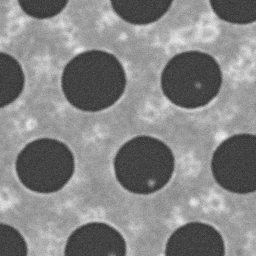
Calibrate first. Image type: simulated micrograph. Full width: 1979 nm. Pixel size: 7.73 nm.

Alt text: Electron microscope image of holes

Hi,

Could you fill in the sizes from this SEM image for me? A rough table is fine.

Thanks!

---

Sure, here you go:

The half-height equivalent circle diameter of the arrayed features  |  472 nanometres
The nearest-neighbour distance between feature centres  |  0.755 microns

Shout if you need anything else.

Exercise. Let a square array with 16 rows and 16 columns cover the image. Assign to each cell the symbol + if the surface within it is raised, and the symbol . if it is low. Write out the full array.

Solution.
+...+++....++...
++++++++.+++++..
++++++++++++++++
.++++..++++..+++
..++....++....++
.+++....++....++
.+++...++++..+++
++++++++++++++++
+++++++++++++++.
+...+++....++...
+....++....++...
+...++++..++++..
++++++++++++++++
++++++++++++++++
.++++..++++...++
..++....++....++